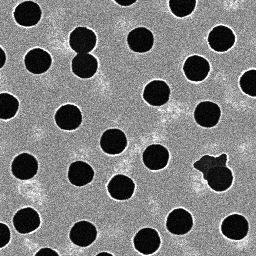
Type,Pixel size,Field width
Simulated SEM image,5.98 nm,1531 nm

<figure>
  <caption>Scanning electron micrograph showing a regular array of holes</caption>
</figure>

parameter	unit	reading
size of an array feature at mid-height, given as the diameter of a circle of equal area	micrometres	0.159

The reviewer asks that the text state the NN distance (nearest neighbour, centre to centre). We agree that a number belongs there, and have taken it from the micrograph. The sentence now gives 280 nanometers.